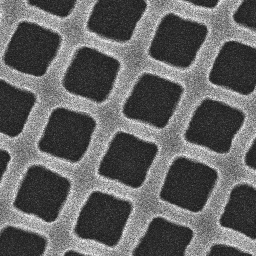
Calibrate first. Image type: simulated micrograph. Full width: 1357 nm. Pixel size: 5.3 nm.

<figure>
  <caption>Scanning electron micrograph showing a regular array of holes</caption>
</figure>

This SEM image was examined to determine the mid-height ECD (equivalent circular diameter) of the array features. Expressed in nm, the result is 282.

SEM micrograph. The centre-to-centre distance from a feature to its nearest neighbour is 64.2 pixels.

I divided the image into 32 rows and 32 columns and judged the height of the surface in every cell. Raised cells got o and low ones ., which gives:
oooo.....ooo......oooooo...ooo..
oooooo...oo.......ooooooooooo...
ooooooooooo......ooo....ooooo...
oo....ooooo......ooo......ooooo.
oo.....ooooo.....oo.......oooooo
o.......ooooooooooo......ooo..oo
o......ooo...oooooo......oo.....
.......oo......ooooo....ooo.....
oo....oo.......ooooooo.ooo......
oooo.ooo.......ooo..oooooo......
.ooooooo......ooo.....ooooo.....
....ooooo.....ooo......oooooo..o
....ooooooo..ooo......oooo.ooooo
....ooo.ooooooo.......ooo....ooo
....oo.....ooooo.....ooo.......o
...ooo......oooooo...ooo......oo
...oo.......ooooooooooo.......oo
ooooo......ooo....ooooo......ooo
ooooo......ooo......oooooo...oo.
.oooooo...ooo......oooooooooooo.
.ooooooooooo.......ooo....ooooo.
.oo....ooooo......ooo......ooooo
ooo......ooooo....ooo......ooooo
oo.......ooooooooooo.......oo...
oo.......oo...oooooo......ooo...
oo......ooo.....ooooo.....oo....
ooo.....oo......oooooooo.ooo....
ooooo..ooo......ooo..oooooo.....
o.ooooooo......ooo......oooo....
.....ooooo.....ooo......ooooooo.
......ooooooo..oo.......ooo.oooo
.....ooo..ooooooo......ooo.....o